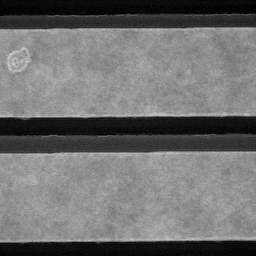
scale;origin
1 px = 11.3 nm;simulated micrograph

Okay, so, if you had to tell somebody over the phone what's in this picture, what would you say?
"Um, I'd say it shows lines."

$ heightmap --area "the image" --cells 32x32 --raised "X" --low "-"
--------------------------------
--------------------------------
--------------------------------
--------------------------------
XXXXXXXXXXXXXXXXXXXXXXXXXXXXXXXX
XXXXXXXXXXXXXXXXXXXXXXXXXXXXXXXX
XXXXXXXXXXXXXXXXXXXXXXXXXXXXXXXX
XXXXXXXXXXXXXXXXXXXXXXXXXXXXXXXX
XXXXXXXXXXXXXXXXXXXXXXXXXXXXXXXX
XXXXXXXXXXXXXXXXXXXXXXXXXXXXXXXX
XXXXXXXXXXXXXXXXXXXXXXXXXXXXXXXX
XXXXXXXXXXXXXXXXXXXXXXXXXXXXXXXX
XXXXXXXXXXXXXXXXXXXXXXXXXXXXXXXX
XXXXXXXXXXXXXXXXXXXXXXXXXXXXXXXX
XXXXXXXXXXXXXXXX----------------
--------------------------------
--------------------------------
--------------------------------
--------------------------------
XXXXXXXXXXXXXXXXXXXXXXXXXXXXXXXX
XXXXXXXXXXXXXXXXXXXXXXXXXXXXXXXX
XXXXXXXXXXXXXXXXXXXXXXXXXXXXXXXX
XXXXXXXXXXXXXXXXXXXXXXXXXXXXXXXX
XXXXXXXXXXXXXXXXXXXXXXXXXXXXXXXX
XXXXXXXXXXXXXXXXXXXXXXXXXXXXXXXX
XXXXXXXXXXXXXXXXXXXXXXXXXXXXXXXX
XXXXXXXXXXXXXXXXXXXXXXXXXXXXXXXX
XXXXXXXXXXXXXXXXXXXXXXXXXXXXXXXX
XXXXXXXXXXXXXXXXXXXXXXXXXXXXXXXX
XXXXXXXXXXXXXXXXXXXXXXXXXXXXXXXX
--------------------------------
--------------------------------